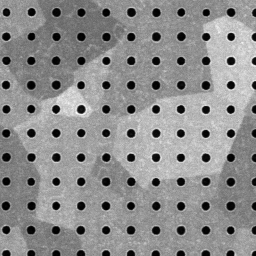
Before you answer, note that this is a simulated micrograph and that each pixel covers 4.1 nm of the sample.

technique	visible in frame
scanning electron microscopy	a regular array of holes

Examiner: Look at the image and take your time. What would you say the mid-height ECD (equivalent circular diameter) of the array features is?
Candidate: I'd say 35.5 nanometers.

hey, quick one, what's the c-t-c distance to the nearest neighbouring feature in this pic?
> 0.0989 um